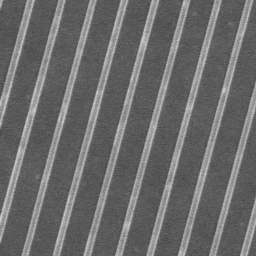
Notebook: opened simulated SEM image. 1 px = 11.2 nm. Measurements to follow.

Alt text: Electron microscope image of parallel lines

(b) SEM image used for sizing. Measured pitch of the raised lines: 339 nanometers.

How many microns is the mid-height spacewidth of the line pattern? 0.272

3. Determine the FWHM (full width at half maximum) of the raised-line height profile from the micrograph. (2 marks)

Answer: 69.1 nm